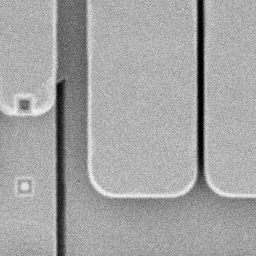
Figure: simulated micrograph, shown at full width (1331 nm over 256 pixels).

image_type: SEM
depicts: wiring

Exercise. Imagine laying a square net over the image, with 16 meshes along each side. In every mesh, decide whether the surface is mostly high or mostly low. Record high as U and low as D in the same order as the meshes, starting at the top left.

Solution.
UUUDDDUUUUUUUUUU
UUUDDDUUUUUUUUUU
UUUDDDUUUUUUUUUU
UUUDDDUUUUUUUUUU
UUUDDDUUUUUUUUUU
UUUDDDUUUUUUUUUU
UUUDDDUUUUUUUUUU
DDDDDDUUUUUUUUUU
DDDDDDUUUUUUUUUU
DDDDDDUUUUUUUUUU
DDDDDDUUUUUUUUUU
DDDDDDUUUUUUDUUU
DDDDDDDDDDDDDDDD
DDDDDDDDDDDDDDDD
DDDDDDDDDDDDDDDD
DDDDDDDDDDDDDDDD